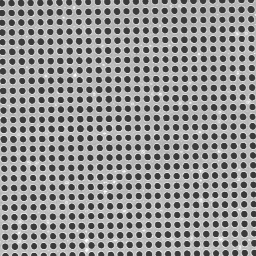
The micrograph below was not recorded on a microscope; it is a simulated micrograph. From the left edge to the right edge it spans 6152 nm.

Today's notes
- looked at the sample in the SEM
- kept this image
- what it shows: a regular array of holes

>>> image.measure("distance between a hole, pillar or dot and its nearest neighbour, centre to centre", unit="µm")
0.222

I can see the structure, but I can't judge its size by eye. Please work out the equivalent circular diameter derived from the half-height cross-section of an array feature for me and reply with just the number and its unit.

156 nm